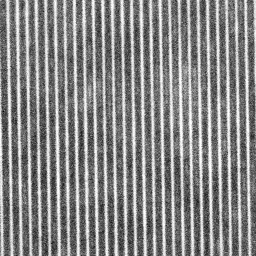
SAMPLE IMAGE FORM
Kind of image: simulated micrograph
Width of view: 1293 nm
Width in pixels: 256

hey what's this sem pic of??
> parallel lines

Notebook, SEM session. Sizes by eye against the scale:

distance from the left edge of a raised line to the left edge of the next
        0.048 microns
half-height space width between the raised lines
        38.5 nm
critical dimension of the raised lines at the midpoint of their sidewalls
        0.0082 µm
